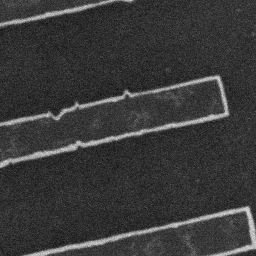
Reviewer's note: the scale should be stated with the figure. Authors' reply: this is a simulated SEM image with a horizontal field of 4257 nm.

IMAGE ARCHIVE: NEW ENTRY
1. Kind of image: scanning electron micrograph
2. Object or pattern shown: one or a few lines or trenches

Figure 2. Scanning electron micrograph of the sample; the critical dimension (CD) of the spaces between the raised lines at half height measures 96.5 px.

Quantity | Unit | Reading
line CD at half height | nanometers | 639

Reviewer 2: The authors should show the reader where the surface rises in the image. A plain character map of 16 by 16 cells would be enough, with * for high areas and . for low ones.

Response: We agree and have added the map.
*****...........
................
................
................
................
...........***..
......********..
.************...
********........
***.............
................
................
................
.............***
.........*******
....***********.